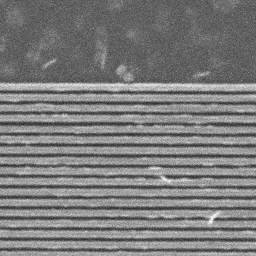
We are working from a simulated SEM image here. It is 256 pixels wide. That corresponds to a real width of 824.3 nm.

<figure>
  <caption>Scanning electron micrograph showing parallel lines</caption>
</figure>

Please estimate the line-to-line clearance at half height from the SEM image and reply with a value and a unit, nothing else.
12.5 nm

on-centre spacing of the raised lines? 33.8 nm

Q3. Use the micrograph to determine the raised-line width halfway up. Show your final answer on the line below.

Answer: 21.7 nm